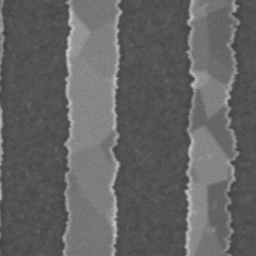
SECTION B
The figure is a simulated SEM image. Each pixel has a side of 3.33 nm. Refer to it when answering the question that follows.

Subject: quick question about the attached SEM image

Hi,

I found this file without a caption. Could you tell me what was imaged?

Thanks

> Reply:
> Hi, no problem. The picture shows one or a few lines or trenches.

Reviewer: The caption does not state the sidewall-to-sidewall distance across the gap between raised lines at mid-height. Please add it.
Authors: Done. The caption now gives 235 nm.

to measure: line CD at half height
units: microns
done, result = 0.154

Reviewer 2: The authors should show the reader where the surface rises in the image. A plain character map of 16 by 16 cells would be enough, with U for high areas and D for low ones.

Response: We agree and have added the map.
DDDDUUUDDDDDUUUD
DDDDUUUDDDDDUUUD
DDDDUUUDDDDDUUUD
DDDDUUUDDDDDUUUD
DDDDUUUDDDDDUUUD
DDDDUUUDDDDDUUDD
DDDDUUUDDDDDUUDD
DDDDUUUDDDDDUUDD
DDDDUUUDDDDDUUUD
DDDDUUUDDDDDUUUD
DDDDUUUDDDDDUUUD
DDDDUUUDDDDDUUDD
DDDDUUUDDDDDUUDD
DDDDUUUDDDDDUUDD
DDDDUUUDDDDDUUDD
DDDDUUUDDDDDUUDD